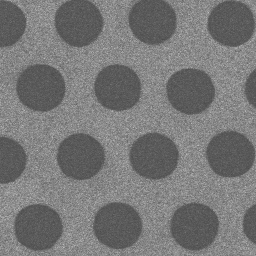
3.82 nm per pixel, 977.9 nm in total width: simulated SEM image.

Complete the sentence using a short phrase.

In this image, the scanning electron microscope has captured a regular array of holes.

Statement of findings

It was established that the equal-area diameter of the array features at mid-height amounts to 0.183 micrometres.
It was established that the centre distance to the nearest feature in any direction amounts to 285 nm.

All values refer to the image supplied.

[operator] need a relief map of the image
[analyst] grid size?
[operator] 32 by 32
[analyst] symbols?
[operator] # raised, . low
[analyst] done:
..######....#####....######....#
...####.....####......####.....#
...####......###......####......
...####......###......####......
...####.....#####....#####.....#
..#######..########.#######...##
################################
################################
###....######...#######.########
##......####.....####.....#####.
##......####......###......####.
##......####......###......####.
##......####.....####......####.
####...######...######....######
################################
################################
############################..##
..######....#####....#####.....#
...####......###......####......
...####......###......####......
...####......###......####......
...#####....#####.....#####....#
..########.#####################
################################
################################
####.#########..########.#######
##.....#####.....#####.....####.
##......####......###......###..
##......####......###......###..
##......####.....#####.....####.
###....######....#####....######
################################